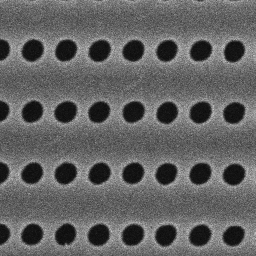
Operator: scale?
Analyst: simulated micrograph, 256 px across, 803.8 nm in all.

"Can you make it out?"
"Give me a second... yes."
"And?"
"a regular array of holes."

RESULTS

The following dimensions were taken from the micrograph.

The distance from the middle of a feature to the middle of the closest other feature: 105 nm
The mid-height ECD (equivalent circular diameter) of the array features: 21.9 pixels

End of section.